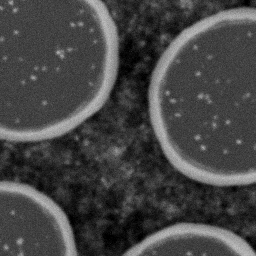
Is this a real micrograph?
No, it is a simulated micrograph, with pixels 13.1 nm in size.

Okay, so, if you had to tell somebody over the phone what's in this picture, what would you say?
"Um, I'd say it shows raised bodies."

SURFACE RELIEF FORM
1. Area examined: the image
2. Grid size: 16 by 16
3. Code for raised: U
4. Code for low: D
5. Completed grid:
UUUUUUDDDDDDDDDD
UUUUUUUDDDDDDUUU
UUUUUUUDDDDUUUUU
UUUUUUUDDDDUUUUU
UUUUUUUDDDUUUUUU
UUUUUUUDDDUUUUUU
UUUUUUDDDDUUUUUU
UUUUUDDDDDUUUUUU
DUDDDDDDDDUUUUUU
DDDDDDDDDDDUUUUU
DDDDDDDDDDDDUUUU
DDDDDDDDDDDDDDDD
UUUDDDDDDDDDDDDD
UUUUDDDDDDDDDDDD
UUUUDDDDDDUUUUDD
UUUUDDDDDUUUUUUD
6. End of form